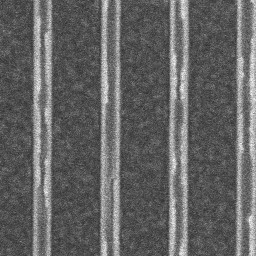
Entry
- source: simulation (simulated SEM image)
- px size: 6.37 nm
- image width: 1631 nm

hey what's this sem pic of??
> one or a few lines or trenches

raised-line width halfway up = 0.0987 micrometres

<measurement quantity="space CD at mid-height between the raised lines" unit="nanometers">338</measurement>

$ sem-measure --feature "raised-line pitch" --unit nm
433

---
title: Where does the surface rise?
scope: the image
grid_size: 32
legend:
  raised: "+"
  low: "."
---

.....+.......++......++.......++
.....+.......++......++.......++
.....+.......++......++.......++
....++.......++......++.......++
....++.......++......++.......++
....++.......++.......+.......++
....++.......++.......+.......++
....++.......++.......+.......++
....++.......++.......+.......++
....++.......++......++.......++
....++.......++......++.......++
....++.......++......++.......++
....++.......++......++.......++
....++.......++......++.......++
....++.......++......++.......++
....++.......++......++.......++
....++.......++......++.......++
....++.......++......++.......++
....++.......++......++.......++
....++.......++......++.......++
....++.......++......++.......++
....++.......++......++.......++
....++.......++......++.......++
....++.......++......++.......++
....++.......++......++.......++
....++.......++......++.......++
....++.......++......++.......++
....++.......++......++.......++
....++.......++......++.......++
....++.......++......++.......++
....++.......++......++.......++
....++.......++......++.......++